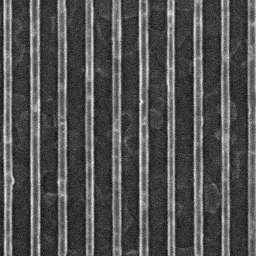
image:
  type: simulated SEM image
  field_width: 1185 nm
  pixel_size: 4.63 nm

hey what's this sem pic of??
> parallel lines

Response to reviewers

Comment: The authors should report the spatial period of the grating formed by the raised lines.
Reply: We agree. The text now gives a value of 126 nanometres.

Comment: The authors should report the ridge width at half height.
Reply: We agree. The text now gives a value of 7.13 pixels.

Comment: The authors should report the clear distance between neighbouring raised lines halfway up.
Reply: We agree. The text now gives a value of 0.0908 microns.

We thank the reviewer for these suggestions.